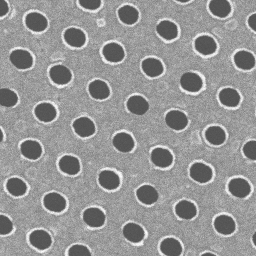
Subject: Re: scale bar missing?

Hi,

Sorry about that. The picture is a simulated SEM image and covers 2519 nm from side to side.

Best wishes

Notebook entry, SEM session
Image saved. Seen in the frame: a regular array of holes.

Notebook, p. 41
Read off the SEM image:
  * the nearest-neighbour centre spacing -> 0.394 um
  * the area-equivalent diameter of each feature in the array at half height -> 20.8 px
